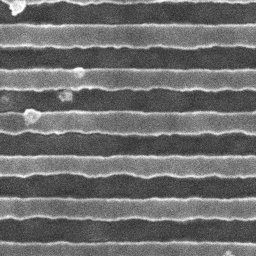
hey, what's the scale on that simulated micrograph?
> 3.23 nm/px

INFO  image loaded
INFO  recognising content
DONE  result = lines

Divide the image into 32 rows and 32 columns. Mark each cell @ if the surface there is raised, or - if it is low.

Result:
-@@@------@---------------------
--------------------------------
--------------------------------
@@@@@@@@@@@@@@@@@@@@@@@@@@@@@@@@
@@@@@@@@@@@@@@@@@@@@@@@@@@@@@@@@
@@@@@@@@@@@@@@@@@@@@@@@@@@@@@@@@
--------------------------------
--------------------------------
--------------------------------
@@@@@@@@@@@@@@@@@@@@@@@@@@@@@@@@
@@@@@@@@@@@@@@@@@@@@@@@@@@@@@@@@
--------@-----------------------
--------------------------------
--------------------------------
@@@@@@@@@@@@@@@@@@@@@@@@@@@@@@@@
@@@@@@@@@@@@@@@@@@@@@@@@@@@@@@@@
@@@-@@@@@-@@@@@@@@@@@@@@@@@@@-@@
--------------------------------
--------------------------------
--------------------------------
@@@@@@@@@@@@@@@@@@@@@@@@@@@@@@@@
@@@@@@@@@@@@@@@@@@@@@@@@@@@@@@@@
--------------------------------
--------------------------------
--------------------------------
@@@@@@@@@@@@@@@@@@@@@@@@@@@@@@@@
@@@@@@@@@@@@@@@@@@@@@@@@@@@@@@@@
------------@@@---@@@@@-----@-@-
--------------------------------
--------------------------------
@@@@@@@@@-@@@@@@@@@@@@@@@@@@@@-@
@@@@@@@@@@@@@@@@@@@@@@@@@@@@@@@@